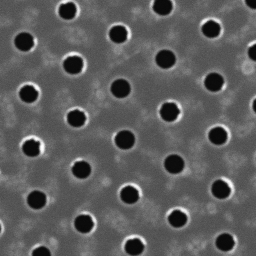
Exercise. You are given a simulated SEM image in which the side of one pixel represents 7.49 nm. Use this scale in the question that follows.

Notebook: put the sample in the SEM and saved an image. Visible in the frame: a regular array of holes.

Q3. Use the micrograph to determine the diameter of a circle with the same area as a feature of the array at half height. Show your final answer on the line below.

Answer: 143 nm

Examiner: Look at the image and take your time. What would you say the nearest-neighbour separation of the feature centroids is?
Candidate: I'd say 393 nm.